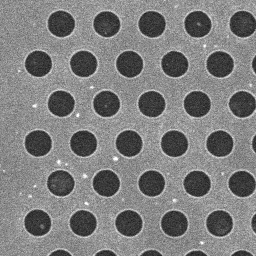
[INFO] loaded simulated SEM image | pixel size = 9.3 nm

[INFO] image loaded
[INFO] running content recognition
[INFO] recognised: a regular array of holes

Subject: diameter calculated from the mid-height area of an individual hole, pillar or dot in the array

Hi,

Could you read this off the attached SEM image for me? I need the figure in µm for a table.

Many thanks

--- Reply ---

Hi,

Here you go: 0.254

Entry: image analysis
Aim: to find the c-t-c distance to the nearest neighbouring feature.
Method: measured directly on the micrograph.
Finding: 422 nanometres